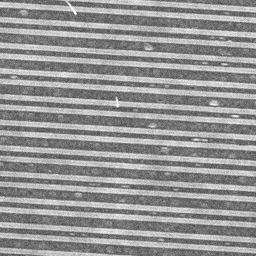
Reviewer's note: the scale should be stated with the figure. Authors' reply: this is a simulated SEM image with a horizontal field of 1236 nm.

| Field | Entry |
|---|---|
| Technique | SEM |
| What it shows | parallel lines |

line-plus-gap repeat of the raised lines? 61.6 nanometers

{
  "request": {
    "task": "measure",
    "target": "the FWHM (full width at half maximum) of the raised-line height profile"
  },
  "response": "23.5 nm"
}